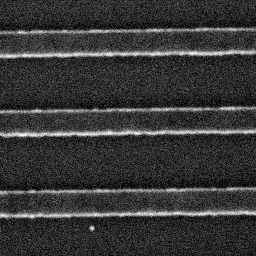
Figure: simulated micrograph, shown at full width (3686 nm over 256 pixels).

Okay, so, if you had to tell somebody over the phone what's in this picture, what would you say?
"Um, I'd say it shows lines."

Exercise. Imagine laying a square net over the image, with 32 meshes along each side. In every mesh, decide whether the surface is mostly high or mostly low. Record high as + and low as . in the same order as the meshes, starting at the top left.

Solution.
................................
................................
................................
................................
++++++++++++++++++++++++++++++++
++++++++++++++++++++++++++++++++
++++++++++++++++++++++++++++++++
................................
................................
................................
................................
................................
................................
................................
++++++++++++++++++++++++++++++++
++++++++++++++++++++++++++++++++
++++++++++++++++++++++++++++++++
................................
................................
................................
................................
................................
................................
................................
++++++++++++++++++++++++++++++++
++++++++++++++++++++++++++++++++
++++++++++++++++++++++++++++++++
................................
................................
................................
................................
................................